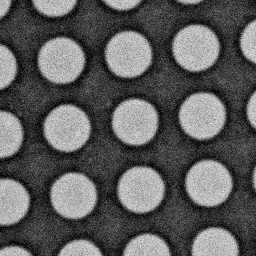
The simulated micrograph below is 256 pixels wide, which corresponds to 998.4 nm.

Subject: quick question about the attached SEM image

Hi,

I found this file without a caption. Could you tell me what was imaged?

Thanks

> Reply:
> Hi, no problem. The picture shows an array of small figures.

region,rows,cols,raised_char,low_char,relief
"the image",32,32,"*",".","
*...*****....****...............
*....***........................
................................
.......................***.....*
..............****....*****...**
......****....*****...*****...**
*....*****...******...*****...**
**...*****...******...*****....*
**...*****....****.....***......
**....****.....**...............
*...............................
................................
................*......****....*
.......***.....****....*****...*
**....*****...******..******...*
**....*****...******...*****....
***...*****...*****....****.....
***...*****....****.............
**.....***......................
*...............................
.........................***....
................***.....*****...
*......****....*****...******...
***....*****...*****...******...
****..******...*****....****....
****...*****...*****.....**.....
***....****......*..............
**..............................
................................
.................**......****...
.........**.....*****...******..
***.....****....*****...******..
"